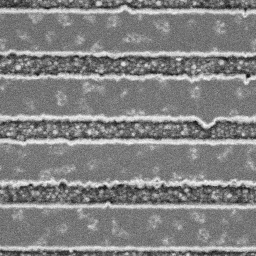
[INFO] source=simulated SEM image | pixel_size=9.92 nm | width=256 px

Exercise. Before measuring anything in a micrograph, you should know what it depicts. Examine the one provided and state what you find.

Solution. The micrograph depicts one or a few lines or trenches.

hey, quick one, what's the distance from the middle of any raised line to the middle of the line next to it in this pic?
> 644 nm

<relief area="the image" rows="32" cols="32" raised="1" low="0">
00000000000000000000000000000000
11111111111111111111111111111101
11111111111111111111111111111111
11111111111111111111111111111111
11111111111111111111111111111111
11111111111111111111111111111111
11111111111111111111111111111111
00000000000000000000000000000000
00000000000000000000000000000000
10000111100100010001000000000000
11111111111111111111111111111111
11111111111111111111111111111111
11111111111111111111111111111111
11111111111111111111111111111111
11111111111111111111111111111111
00000000000000000000000001100000
00000000000000000000000000000000
00000000000000000000000000000000
11111111111111111111111111111111
11111111111111111111111111111111
11111111111111111111111111111111
11111111111111111111111111111111
11111111111111111111111111111111
00000000000000000000000000000000
00000000000000000000000000000000
00000000000000000000000000000000
11111111111111111111111111111111
11111111111111111111111111111111
11111111111111111111111111111111
11111111111111111111111111111111
11111111111111111111111111111111
00000000000000000000000000000000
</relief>